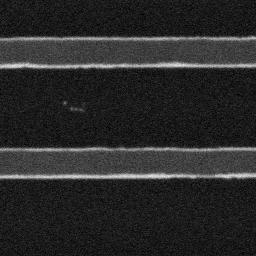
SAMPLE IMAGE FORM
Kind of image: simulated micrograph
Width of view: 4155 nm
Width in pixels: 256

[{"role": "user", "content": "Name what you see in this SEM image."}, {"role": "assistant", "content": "lines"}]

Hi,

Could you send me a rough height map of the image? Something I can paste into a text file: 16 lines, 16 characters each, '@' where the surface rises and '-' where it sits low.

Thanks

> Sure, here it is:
----------------
----------------
@@@@@@@@@@@@@@@@
@@@@@@@@@@@@@@@@
----------------
----------------
----------------
----------------
----------------
@@@@@@@@@@@@@@@@
@@@@@@@@@@@@@@@@
----------------
----------------
----------------
----------------
----------------